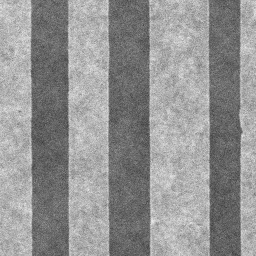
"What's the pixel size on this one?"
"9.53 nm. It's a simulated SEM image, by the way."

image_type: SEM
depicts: one or a few lines or trenches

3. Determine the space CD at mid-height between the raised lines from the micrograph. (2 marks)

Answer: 362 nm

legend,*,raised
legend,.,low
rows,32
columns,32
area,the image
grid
****.....****......*******....**
****.....****......*******....**
****.....****......*******....**
****.....****......*******....**
****.....****......*******....**
****.....*****.....*******....**
****.....*****.....*******....**
****.....*****.....*******....**
****.....****......*******....**
****.....****......*******....**
****.....****......*******....**
****.....****......*******....**
****.....****......*******....**
****.....****......*******....**
****.....****......*******....**
****.....****......*******....**
****.....****......*******....**
****.....****......*******....**
****.....****......*******....**
****.....****......*******....**
****.....****......*******....**
****.....****......*******....**
****.....****......*******....**
****.....****......*******....**
****.....****......*******....**
****.....****......*******....**
****.....****......*******....**
****.....****......*******....**
****.....*****.....*******....**
****.....*****.....*******....**
****.....*****.....*******....**
****.....*****.....*******....**